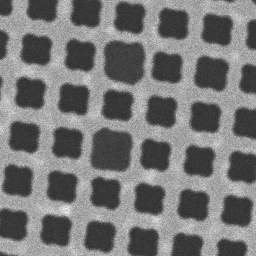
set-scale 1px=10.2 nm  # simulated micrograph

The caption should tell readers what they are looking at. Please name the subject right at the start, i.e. a regular array of holes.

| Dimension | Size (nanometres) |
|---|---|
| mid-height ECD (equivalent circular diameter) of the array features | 337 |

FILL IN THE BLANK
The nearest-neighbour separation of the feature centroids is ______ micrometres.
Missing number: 0.45